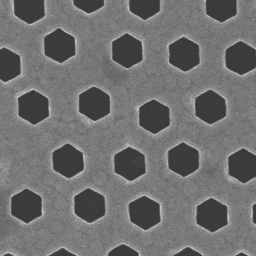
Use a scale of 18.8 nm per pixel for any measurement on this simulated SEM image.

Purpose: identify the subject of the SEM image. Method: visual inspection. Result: a regular array of holes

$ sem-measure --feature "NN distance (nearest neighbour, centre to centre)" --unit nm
1070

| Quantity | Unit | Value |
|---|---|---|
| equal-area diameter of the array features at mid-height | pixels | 32.2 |